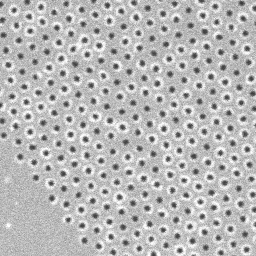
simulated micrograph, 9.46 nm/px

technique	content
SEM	a regular array of holes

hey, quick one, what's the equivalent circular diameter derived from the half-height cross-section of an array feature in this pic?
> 65 nanometers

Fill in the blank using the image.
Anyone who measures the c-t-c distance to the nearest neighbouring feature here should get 139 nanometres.